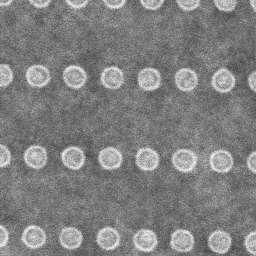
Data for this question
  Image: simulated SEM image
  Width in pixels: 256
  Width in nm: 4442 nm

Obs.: a regular array of raised bodies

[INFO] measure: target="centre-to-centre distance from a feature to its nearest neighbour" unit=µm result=0.639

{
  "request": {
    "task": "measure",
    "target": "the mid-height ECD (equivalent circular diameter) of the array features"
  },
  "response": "356 nm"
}